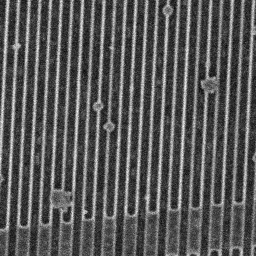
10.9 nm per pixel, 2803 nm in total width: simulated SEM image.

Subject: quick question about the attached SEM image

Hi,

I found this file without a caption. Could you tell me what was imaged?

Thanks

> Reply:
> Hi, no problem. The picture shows parallel lines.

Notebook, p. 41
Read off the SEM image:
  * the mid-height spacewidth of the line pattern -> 91.6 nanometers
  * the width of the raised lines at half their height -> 20.5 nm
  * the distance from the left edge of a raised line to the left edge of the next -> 117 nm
